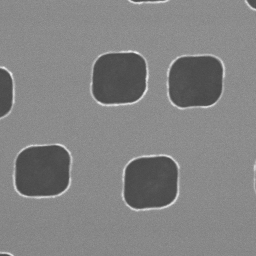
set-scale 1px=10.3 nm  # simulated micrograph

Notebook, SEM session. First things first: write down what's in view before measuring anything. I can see holes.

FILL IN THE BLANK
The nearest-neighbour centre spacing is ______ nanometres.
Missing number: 957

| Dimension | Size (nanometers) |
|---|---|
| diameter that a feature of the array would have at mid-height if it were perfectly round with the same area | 579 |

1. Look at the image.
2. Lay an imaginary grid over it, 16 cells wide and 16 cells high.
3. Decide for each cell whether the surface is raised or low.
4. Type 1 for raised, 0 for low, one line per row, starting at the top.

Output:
1111111111111111
1111111111111111
1111111111111111
1111110001111111
1111110001100011
0111110001100011
0111111111100111
1111111111111111
1111111111111111
1000111111111111
1000111100011111
1000111100011111
1111111100011111
1111111111111111
1111111111111111
1111111111111111